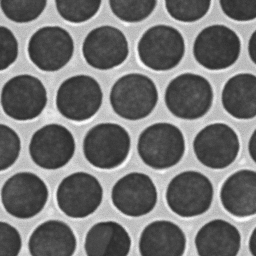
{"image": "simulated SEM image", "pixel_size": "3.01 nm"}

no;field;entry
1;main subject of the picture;a regular array of holes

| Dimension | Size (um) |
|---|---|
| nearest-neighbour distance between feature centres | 0.166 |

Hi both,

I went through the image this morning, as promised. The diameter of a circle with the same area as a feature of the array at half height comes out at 46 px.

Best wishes